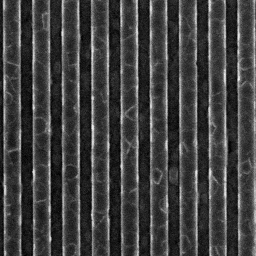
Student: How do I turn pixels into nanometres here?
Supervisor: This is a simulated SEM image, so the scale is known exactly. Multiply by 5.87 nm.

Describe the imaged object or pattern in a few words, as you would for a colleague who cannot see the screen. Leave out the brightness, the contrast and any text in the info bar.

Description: parallel lines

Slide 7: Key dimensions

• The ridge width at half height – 99.7 nm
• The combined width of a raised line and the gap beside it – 172 nm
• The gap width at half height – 71.1 nm